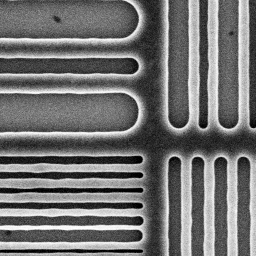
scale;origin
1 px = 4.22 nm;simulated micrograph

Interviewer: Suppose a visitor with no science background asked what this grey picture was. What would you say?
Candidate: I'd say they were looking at groups of lines, slits or small figures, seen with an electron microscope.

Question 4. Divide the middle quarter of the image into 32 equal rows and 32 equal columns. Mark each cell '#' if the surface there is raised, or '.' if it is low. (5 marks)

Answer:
...................#######.....#
...................#######......
..................########.....#
##########################.....#
##########################.....#
##########################.....#
##########################.....#
................##########.....#
.................#########.....#
..................########.....#
...................#######.....#
...................#######......
...................#######......
..................########.....#
..................########.....#
.................##########...##
................################
################################
################################
################################
################################
################################
################################
....................#######..###
....................######....##
##########################....##
##########################....##
....................######....##
...................#######....##
##########################....##
##########################....##
....................######....##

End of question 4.